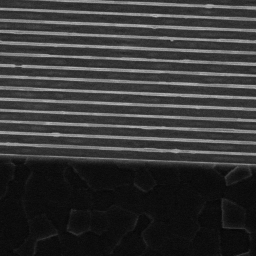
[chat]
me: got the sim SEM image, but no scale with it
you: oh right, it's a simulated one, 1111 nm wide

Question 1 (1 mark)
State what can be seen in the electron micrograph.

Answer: parallel lines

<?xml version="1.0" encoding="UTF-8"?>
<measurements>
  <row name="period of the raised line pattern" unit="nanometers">48.8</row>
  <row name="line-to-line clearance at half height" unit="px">8.99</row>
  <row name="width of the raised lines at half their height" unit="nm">11.9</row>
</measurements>